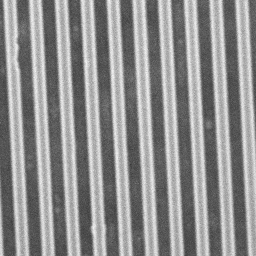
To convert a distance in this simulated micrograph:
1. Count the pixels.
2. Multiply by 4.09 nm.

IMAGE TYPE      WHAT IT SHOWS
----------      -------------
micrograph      parallel lines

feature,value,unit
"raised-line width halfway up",47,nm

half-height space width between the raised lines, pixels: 14.5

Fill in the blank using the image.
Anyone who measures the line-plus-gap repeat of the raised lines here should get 0.105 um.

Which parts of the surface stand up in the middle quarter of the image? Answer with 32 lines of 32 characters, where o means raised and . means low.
oo...ooo....oo....ooo....oo....o
oo...ooo....oo....ooo....oo....o
oo...ooo....oo....ooo....oo....o
oo...ooo....ooo...ooo....ooo...o
oo...ooo....ooo...ooo....ooo...o
oo...ooo....ooo...ooo....ooo...o
oo...ooo....ooo...ooo....ooo....
oo....oo....ooo....oo....ooo....
oo....oo....ooo....oo....ooo....
oo....oo....ooo....oo....ooo....
oo....oo....ooo....oo....ooo....
oo....oo....ooo....oo....ooo....
oo....oo....ooo....oo....ooo....
oo....ooo...ooo....ooo...ooo....
oo....ooo...ooo....ooo...ooo....
oo....ooo...ooo....ooo...ooo....
oo....ooo....oo....ooo....oo....
oo....ooo....oo....ooo....oo....
ooo...ooo....oo....ooo....oo....
ooo...ooo....oo....ooo....oo....
ooo...ooo....oo....ooo....oo....
ooo...ooo....oo....ooo....oo....
ooo...ooo....oo....ooo....oo....
ooo...ooo....ooo...ooo....ooo...
ooo...ooo....ooo...ooo....ooo...
ooo...ooo....ooo...ooo....ooo...
ooo....oo....ooo....oo....ooo...
ooo....oo....ooo....oo....ooo...
ooo....oo....ooo....oo....ooo...
ooo....oo....ooo....oo....ooo...
ooo....oo....ooo....oo....ooo...
ooo....oo....ooo....oo....ooo...